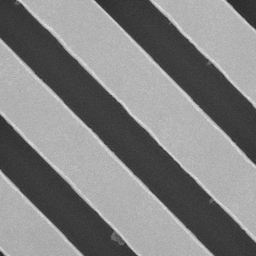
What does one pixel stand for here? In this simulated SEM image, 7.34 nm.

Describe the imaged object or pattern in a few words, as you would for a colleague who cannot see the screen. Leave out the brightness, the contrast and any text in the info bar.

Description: lines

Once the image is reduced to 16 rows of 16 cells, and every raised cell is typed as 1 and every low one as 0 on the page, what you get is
0011110000111110
0001111000011111
0000111100001111
1000011110000111
1100011111000011
1110000111100001
1111000011110000
1111100011111000
0111110001111100
0011111000111110
0001111100011111
1000111110001111
1100011111000111
1110001111100011
1111000111110001
1111100011111000